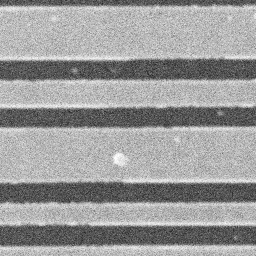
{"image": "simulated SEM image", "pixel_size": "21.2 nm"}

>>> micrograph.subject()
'lines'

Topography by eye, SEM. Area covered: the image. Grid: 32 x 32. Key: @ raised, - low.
--------------------------------
@@@@@@@@@@@@@@@@@@@@@@@@@@@@@@@@
@@@@@@@@@@@@@@@@@@@@@@@@@@@@@@@@
@@@@@@@@@@@@@@@@@@@@@@@@@@@@@@@@
@@@@@@@@@@@@@@@@@@@@@@@@@@@@@@@@
@@@@@@@@@@@@@@@@@@@@@@@@@@@@@@@@
@@@@@@@@@@@@@@@@@@@@@@@@@@@@@@@@
--------------------------------
--------------------------------
--------------------------------
@@@@@@@@@@@@@@@@@@@@@@@@@@@@@@@@
@@@@@@@@@@@@@@@@@@@@@@@@@@@@@@@@
@@@@@@@@@@@@@@@@@@@@@@@@@@@@@@@@
--------------------------------
--------------------------------
--------------------------------
@@@@@@@@@@@@@@@@@@@@@@@@@@@@@@@@
@@@@@@@@@@@@@@@@@@@@@@@@@@@@@@@@
@@@@@@@@@@@@@@@@@@@@@@@@@@@@@@@@
@@@@@@@@@@@@@@@@@@@@@@@@@@@@@@@@
@@@@@@@@@@@@@@@@@@@@@@@@@@@@@@@@
@@@@@@@@@@@@@@@@@@@@@@@@@@@@@@@@
@@@@@@@@@@@@@@@@@@@@@@@@@@@@@@@@
--------------------------------
--------------------------------
@@-@@@@@@@@@-@@@@@@@@@@@@@@@@@@@
@@@@@@@@@@@@@@@@@@@@@@@@@@@@@@@@
@@@@@@@@@@@@@@@@@@@@@@@@@@@@@@@@
--------------------------------
--------------------------------
--------------------------------
@@@@@@@@@@@@@@@@@@@@@@@@@@@@@@@@